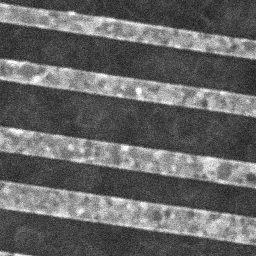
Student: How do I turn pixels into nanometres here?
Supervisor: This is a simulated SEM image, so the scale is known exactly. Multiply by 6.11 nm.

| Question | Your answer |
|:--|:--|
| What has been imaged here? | one or a few lines or trenches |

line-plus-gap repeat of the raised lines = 367 nanometres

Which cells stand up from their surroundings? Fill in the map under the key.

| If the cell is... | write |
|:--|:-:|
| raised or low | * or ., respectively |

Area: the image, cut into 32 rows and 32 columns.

................................
*******.........................
***************.................
......***************...........
.............**************.....
...................*************
..........................******
................................
********........................
**************..................
.....****************...........
...........*****************....
..................**************
.........................*******
................................
................................
****............................
***********.....................
*****************...............
......*******************.......
............********************
...................*************
..........................******
******..........................
*************...................
*******************.............
....**********************......
...........*********************
..................**************
.........................*******
...............................*
................................